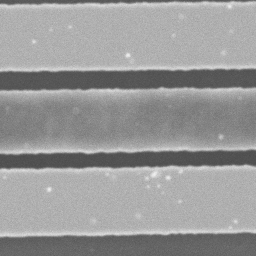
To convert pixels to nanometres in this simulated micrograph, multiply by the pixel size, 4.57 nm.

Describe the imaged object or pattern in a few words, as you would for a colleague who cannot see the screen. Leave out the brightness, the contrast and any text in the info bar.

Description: lines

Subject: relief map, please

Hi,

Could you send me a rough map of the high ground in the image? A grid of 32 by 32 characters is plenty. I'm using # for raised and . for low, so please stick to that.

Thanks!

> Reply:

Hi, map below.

.....##..#######################
################################
################################
################################
################################
################################
################################
################################
################################
................................
................................
################################
################################
################################
################################
################################
################################
################################
################################
................................
................................
################################
################################
################################
################################
################################
################################
################################
################################
####............................
................................
................................